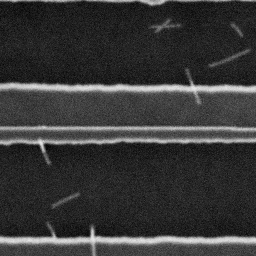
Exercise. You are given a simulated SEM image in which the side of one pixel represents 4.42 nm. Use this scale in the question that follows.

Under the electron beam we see lines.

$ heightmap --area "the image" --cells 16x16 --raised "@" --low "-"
----------------
----------------
----------------
----------------
----------------
@@@@---@----@---
@@@@@@@@@@@@@@@@
@@@@@@@@@@@@@@@@
@@@@@@@@@@@@@@@@
----------------
----------------
----------------
----------------
----------------
----------------
@@@@@@@@@@@@@@@@